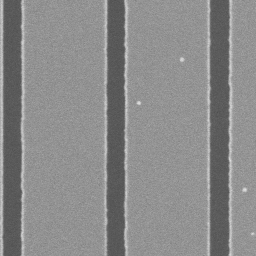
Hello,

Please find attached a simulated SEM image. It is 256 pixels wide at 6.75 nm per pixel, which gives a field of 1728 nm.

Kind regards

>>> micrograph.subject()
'lines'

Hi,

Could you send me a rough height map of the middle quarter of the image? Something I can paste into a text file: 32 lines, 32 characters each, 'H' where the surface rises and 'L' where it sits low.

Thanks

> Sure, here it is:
HHHHHHHHHHHLLLLHHHHHHHHHHHHHHHHH
HHHHHHHHHHHLLLLHHHHHHHHHHHHHHHHH
HHHHHHHHHHHLLLLHHHHHHHHHHHHHHHHH
HHHHHHHHHHHLLLLHHHHHHHHHHHHHHHHH
HHHHHHHHHHHLLLLHHHHHHHHHHHHHHHHH
HHHHHHHHHHLLLLLHHHHHHHHHHHHHHHHH
HHHHHHHHHHHLLLLHHHHHHHHHHHHHHHHH
HHHHHHHHHHHLLLLHHHHHHHHHHHHHHHHH
HHHHHHHHHHHLLLLHHHHHHHHHHHHHHHHH
HHHHHHHHHHHLLLLHHHHHHHHHHHHHHHHH
HHHHHHHHHHHLLLLHHHHHHHHHHHHHHHHH
HHHHHHHHHHHLLLLHHHHHHHHHHHHHHHHH
HHHHHHHHHHHLLLLHHHHHHHHHHHHHHHHH
HHHHHHHHHHHLLLLHHHHHHHHHHHHHHHHH
HHHHHHHHHHHLLLLHHHHHHHHHHHHHHHHH
HHHHHHHHHHHLLLLHHHHHHHHHHHHHHHHH
HHHHHHHHHHHLLLLHHHHHHHHHHHHHHHHH
HHHHHHHHHHHLLLLHHHHHHHHHHHHHHHHH
HHHHHHHHHHLLLLLHHHHHHHHHHHHHHHHH
HHHHHHHHHHHLLLLHHHHHHHHHHHHHHHHH
HHHHHHHHHHHLLLLHHHHHHHHHHHHHHHHH
HHHHHHHHHHHLLLLHHHHHHHHHHHHHHHHH
HHHHHHHHHHHLLLLHHHHHHHHHHHHHHHHH
HHHHHHHHHHHLLLLHHHHHHHHHHHHHHHHH
HHHHHHHHHHHLLLLHHHHHHHHHHHHHHHHH
HHHHHHHHHHLLLLLHHHHHHHHHHHHHHHHH
HHHHHHHHHHLLLLLHHHHHHHHHHHHHHHHH
HHHHHHHHHHHLLLLHHHHHHHHHHHHHHHHH
HHHHHHHHHHHLLLLHHHHHHHHHHHHHHHHH
HHHHHHHHHHHLLLLHHHHHHHHHHHHHHHHH
HHHHHHHHHHHLLLLHHHHHHHHHHHHHHHHH
HHHHHHHHHHHLLLLHHHHHHHHHHHHHHHHH